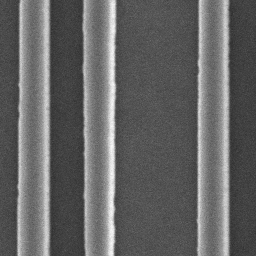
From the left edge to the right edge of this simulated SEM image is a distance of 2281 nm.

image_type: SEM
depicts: lines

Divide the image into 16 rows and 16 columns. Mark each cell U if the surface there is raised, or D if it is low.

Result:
DUUDDUUDDDDDUUDD
DUUDDUUDDDDDUUDD
DUUDDUUDDDDDUUDD
DUUDDUUDDDDDUUDD
DUUDDUUDDDDDUUDD
DUUDDUUDDDDDUUDD
DUUDDUUDDDDDUUDD
DUUDDUUDDDDDUUDD
DUUDDUUDDDDDUUDD
DUUDDUUDDDDDUUDD
DUUDDUUDDDDDUUDD
DUUDDUUDDDDDUUDD
DUUDDUUDDDDDUUDD
DUUDDUUDDDDDUUDD
DUUDDUUDDDDDUUDD
DUUDDUUDDDDDUUDD